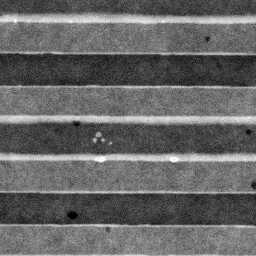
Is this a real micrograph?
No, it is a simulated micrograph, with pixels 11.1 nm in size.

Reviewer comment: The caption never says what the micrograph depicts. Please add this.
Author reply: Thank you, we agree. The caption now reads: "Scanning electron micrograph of lines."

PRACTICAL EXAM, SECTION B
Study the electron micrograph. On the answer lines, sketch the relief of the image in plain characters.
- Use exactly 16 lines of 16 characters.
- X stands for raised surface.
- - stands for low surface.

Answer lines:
----------------
XXXXXXXXXXXXXXXX
XXXXXXXXXXXXXXXX
----------------
----------------
XXXXXXXXXXXXXXXX
XXXXXXXXXXXXXXXX
----------------
----------------
----------------
XXXXXXXXXXXXXXXX
XXXXXXXXXXXXXXXX
----------------
----------------
XXXXXXXXXXXXXXXX
XXXXXXXXXXXXXXXX